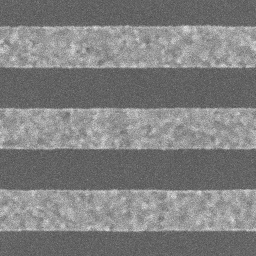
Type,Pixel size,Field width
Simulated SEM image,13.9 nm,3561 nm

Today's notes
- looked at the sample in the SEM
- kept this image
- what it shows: one or a few lines or trenches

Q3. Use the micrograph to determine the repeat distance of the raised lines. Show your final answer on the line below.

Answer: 1140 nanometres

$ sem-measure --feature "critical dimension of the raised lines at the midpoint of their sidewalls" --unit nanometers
551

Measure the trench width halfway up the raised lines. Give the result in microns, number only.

0.577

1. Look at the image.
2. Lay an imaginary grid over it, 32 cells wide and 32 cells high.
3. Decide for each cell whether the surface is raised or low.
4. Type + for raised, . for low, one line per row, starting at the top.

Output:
................................
................................
................................
++++++++++++++++++++++++++++++++
++++++++++++++++++++++++++++++++
+++++++++++++++++++++++++++++++.
++++++++++++++++++++++++++++++++
++++++++++++++++++++++++++++++++
................................
................................
................................
................................
................................
................................
++++++++++++++++++++++++++++++++
++++++++++++++++++++++++++++++++
++++++++++++++++++++++++++++++++
++++++++++++++++++++++++++++++++
+++++++..+++++++++++++++++++++++
................................
................................
................................
................................
................................
++++++++++++++++++++++++++++++++
++++++++++++++++++++++++++++++++
++++++++++++++++++++++++++++++++
++++++++++++++++++++++++++++++++
++++++++++++++++++++++++++++++++
................................
................................
................................